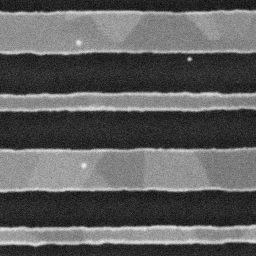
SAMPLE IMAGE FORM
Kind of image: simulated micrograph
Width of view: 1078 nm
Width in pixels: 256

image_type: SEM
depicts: lines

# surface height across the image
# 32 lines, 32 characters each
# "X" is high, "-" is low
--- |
--------------------------------
--------XXXXXXXXXX--------XXXXXX
XXXXXXXXXXXXXXXXXXXXXXXXXXXXXXXX
XXXXXXXXXXXXXXXXXXXXXXXXXXXXXXXX
XXXXXXXXXXXXXXXXXXXXXXXXXXXXXXXX
XXXXXXXXXXXXXXXXXXXXXXXXXXXXXXXX
XXXXXXXXXXX-----XX-XXXXXXXX--XXX
--------------------------------
--------------------------------
--------------------------------
--------------------------------
--------------------------------
XXXXXXXXXXXXXXXXXXXXXXXXXXXXXXXX
XXXXXXXXXXXXXXXXXXXXXXXXXXXXXXXX
--------------------------------
--------------------------------
--------------------------------
--------------------------------
--------------------------------
XXXXXXXXXXXXXXXXXXXXXXXXXXXXXXXX
XXXXXXXXXXXXXXXXXXXXXXXXXXXXXXXX
XXXXXXXXXXXXXXXXXXXXXXXXXXXXXXXX
XXXXXXXXXXXXXXXXXXXXXXXXXXXXXXXX
XXXXXXXXXXXXXXXXXXXXXXXXXXXXXXXX
--------------------------------
--------------------------------
--------------------------------
--------------------------------
XXXXXXXXXXXXXXXXXXXXXXXXXXXXXXXX
XXXXXXXXXXXXXXXXXXXXXXXXXXXXXXXX
XXXXXX-XXX----------------------
--------------------------------